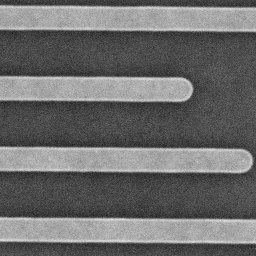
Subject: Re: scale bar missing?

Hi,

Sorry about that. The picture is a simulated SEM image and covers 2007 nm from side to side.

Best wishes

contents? groups of lines, slits or small figures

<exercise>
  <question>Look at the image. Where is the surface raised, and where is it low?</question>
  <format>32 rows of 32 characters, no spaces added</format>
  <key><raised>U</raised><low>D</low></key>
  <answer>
DDDDDDDDDDDDDDDDDDDDDDDDDDDDDDDD
UUUUUUUUUUUUUUUUUUUUUUUUUUUUUUUU
UUUUUUUUUUUUUUUUUUUUUUUUUUUUUUUU
UUUUUUUUUUUUUUUUUUUUUUUUUUUUUUUU
DDDDDDDDDDDDDDDDDDDDDDDDDDDDDDDD
DDDDDDDDDDDDDDDDDDDDDDDDDDDDDDDD
DDDDDDDDDDDDDDDDDDDDDDDDDDDDDDDD
DDDDDDDDDDDDDDDDDDDDDDDDDDDDDDDD
DDDDDDDDDDDDDDDDDDDDDDDDDDDDDDDD
DDDDDDDDDDDDDDDDDDDDDDDDDDDDDDDD
UUUUUUUUUUUUUUUUUUUUUUUUDDDDDDDD
UUUUUUUUUUUUUUUUUUUUUUUUDDDDDDDD
DDDDDDDDDDDUUUUUUUUUUUUDDDDDDDDD
DDDDDDDDDDDDDDDDDDDDDDDDDDDDDDDD
DDDDDDDDDDDDDDDDDDDDDDDDDDDDDDDD
DDDDDDDDDDDDDDDDDDDDDDDDDDDDDDDD
DDDDDDDDDDDDDDDDDDDDDDDDDDDDDDDD
DDDDDDDDDDDDDDDDDDDDDDDDDDDDDDDD
DDDDDDDDDDDDDDDDDDDDDDDDDDDDDDDD
UUUUUUUUUUUUUUUUUUUUUUUUUUUUUUUD
UUUUUUUUUUUUUUUUUUUUUUUUUUUUUUUD
DDDDDDDDDDDDDDDDDDDDDDDDDDDDUUDD
DDDDDDDDDDDDDDDDDDDDDDDDDDDDDDDD
DDDDDDDDDDDDDDDDDDDDDDDDDDDDDDDD
DDDDDDDDDDDDDDDDDDDDDDDDDDDDDDDD
DDDDDDDDDDDDDDDDDDDDDDDDDDDDDDDD
DDDDDDDDDDDDDDDDDDDDDDDDDDDDDDDD
UUUUUUUUUUUUUUUUUUUUUUUUUUUUUUUD
UUUUUUUUUUUUUUUUUUUUUUUUUUUUUUUU
UUUUUUUUUUUUUUUUUUUUUUUUUUUUUUUU
DDDDDDDDDDDDDDDDDDDDDDDDDDDDDDDD
DDDDDDDDDDDDDDDDDDDDDDDDDDDDDDDD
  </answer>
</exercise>